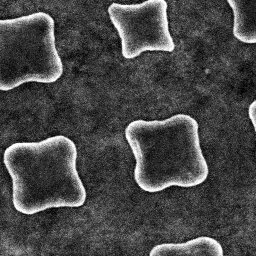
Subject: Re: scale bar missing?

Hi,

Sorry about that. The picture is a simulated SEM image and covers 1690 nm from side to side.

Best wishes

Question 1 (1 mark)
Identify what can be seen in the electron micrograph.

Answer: raised bodies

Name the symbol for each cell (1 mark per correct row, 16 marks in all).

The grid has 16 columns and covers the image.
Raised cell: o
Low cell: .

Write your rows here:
.......ooo.....o
ooo....ooo.....o
ooo.....ooo....o
oooo............
oooo............
o...............
................
..........oo....
........oooo....
ooooo...ooooo...
ooooo....oooo...
.oooo....ooo....
.oooo...........
................
................
..........oooo..